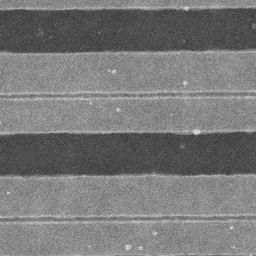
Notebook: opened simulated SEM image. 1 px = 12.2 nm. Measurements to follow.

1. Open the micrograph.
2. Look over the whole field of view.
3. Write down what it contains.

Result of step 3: lines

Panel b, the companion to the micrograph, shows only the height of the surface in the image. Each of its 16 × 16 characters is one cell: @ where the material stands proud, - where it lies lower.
@@@@@@@----@----
----------------
----------------
@@@@@@@@@@@@@@@@
@@@@@@@@@@@@@@@@
@@@@@@@@@@@@@@@@
@@@@@@@@@@@@@@@@
@@@@@@@@@@@@@@@@
----------------
----------------
----------------
@@@@@@@@@@@@@@@@
@@@@@@@@@@@@@@@@
@@@@@@@@@@@@@@@@
@@@@@@@@@@@@@@@@
@@@@@@@@@@@@@@@@